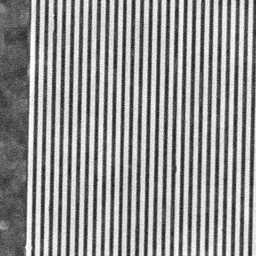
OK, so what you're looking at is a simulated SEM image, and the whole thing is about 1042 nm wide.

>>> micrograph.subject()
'parallel lines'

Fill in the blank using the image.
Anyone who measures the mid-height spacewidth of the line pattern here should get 20.9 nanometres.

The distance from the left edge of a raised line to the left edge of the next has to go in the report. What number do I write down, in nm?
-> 35.3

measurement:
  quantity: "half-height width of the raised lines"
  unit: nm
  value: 14.3